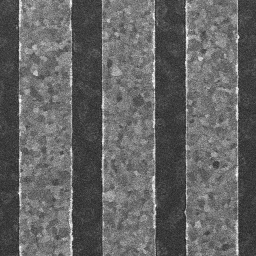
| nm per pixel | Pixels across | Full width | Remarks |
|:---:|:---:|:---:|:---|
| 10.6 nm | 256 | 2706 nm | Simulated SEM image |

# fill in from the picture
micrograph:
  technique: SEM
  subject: one or a few lines or trenches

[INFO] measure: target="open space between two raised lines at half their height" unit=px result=30.9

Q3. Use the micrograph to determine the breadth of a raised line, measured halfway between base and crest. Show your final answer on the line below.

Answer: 551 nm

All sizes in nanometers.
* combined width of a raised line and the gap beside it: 879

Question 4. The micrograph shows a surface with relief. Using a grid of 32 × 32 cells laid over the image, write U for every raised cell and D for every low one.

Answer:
DDUUUUUUUDDDDUUUUUUUDDDUUUUUUUDD
DDUUUUUUUDDDDUUUUUUUUDDUUUUUUUDD
DDUUUUUUUDDDDUUUUUUUDDDUUUUUUUDD
DDUUUUUUUDDDDUUUUUUDDDUUUUUUUUDD
DDUUUUUUUDDDDUUUUUUDDDDUUUUUUUDD
DDUUUUUUUDDDDUUUUUUDDDDUUUUUUUDD
DDUUUUUUUDDUDUUUUUUDDDDUUUUUUUDD
DDUUUUUUUDDDDUUUUUUDDDDUUUUUUUDD
DDUUUUUUUDDDDUUUUUUDDDDUUUUUUUDD
DDUUUUUUUDDDDUUUUUUDDDDUUUUUUUDD
DDUUUUUUUDDDDUUUUUUDDDDUUUUUUUDD
DDUUUUUUUDDDDUUUUUUDDDDUUUUUUUDD
DDUUUUUUUDDDDUUUUUUDDDDUUUUUUUDD
DDUUUUUUUDDDDUUUUUUDDDDUUUUUUUDD
DDUUUUUUUDDDDUUUUUUDDDDUUUUUUUDD
DDUUUUUUUDDDDUUUUUUDDDDUUUUUUUDD
DDUUUUUUUDDDDUUUUUUDDDDUUUUUUUDD
DDUUUUUUUDDDDUUUUUUDDDDUUUUUUUDD
DDUUUUUUUDDDDUUUUUUDDDDUUUUUUUDD
DDUUUUUUUDDDDUUUUUUDDDDUUUUUUUDD
DDUUUUUUUDDDDUUUUUUDDDDUUUUUUUDD
DDUUUUUUUDDDDUUUUUUDDDDUUUUUUUDD
DDDUUUUUUDDDDUUUUUUDDDDUUUUUUUDD
DDUUUUUUUDDDDUUUUUUDDDDUUUUUUUDD
DDUUUUUUUDDDDUUUUUUDDDDUUUUUUUDD
DDDUUUUUUDDDDUUUUUUDDDDUUUUUUUDD
DDDUUUUUUDDDDUUUUUUDDDDUUUUUUUDD
DDUUUUUUUDDDDUUUUUUDDDDUUUUUUUDD
DDUUUUUUUDDDDUUUUUUDDDDUUUUUUUDD
DDUUUUUUUDDDDUUUUUUDDDDUUUUUUUDD
DDUUUUUUUDDDDUUUUUUUDDDUUUUUUUDD
DDUUUUUUUDDDDUUUUUUUUDDUUUUUUUDD